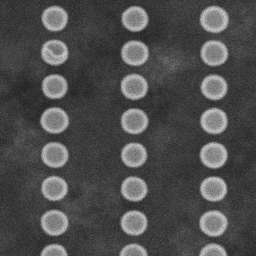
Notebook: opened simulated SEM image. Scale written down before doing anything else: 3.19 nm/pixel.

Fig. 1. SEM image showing a regular array of raised bodies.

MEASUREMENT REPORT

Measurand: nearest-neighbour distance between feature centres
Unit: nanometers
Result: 108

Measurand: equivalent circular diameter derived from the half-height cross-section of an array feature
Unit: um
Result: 0.0776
